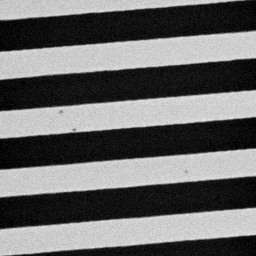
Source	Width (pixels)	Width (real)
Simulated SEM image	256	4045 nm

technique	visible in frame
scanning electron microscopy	lines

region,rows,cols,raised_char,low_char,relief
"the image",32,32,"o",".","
oooooooooooooooooooooooo........
oooooooooooo....................
................................
................................
........................oooooooo
............oooooooooooooooooooo
oooooooooooooooooooooooooooooooo
ooooooooooooooooooooooooooooo...
ooooooooooooooooo...............
ooooo...........................
................................
.............................ooo
.................ooooooooooooooo
......oooooooooooooooooooooooooo
oooooooooooooooooooooooooooooooo
ooooooooooooooooooooo...........
ooooooooo.......................
................................
................................
.....................ooooooooooo
.........ooooooooooooooooooooooo
oooooooooooooooooooooooooooooooo
oooooooooooooooooooooooooo......
oooooooooooooo..................
oo..............................
................................
..........................oooooo
..............oooooooooooooooooo
...ooooooooooooooooooooooooooooo
oooooooooooooooooooooooooooooo..
oooooooooooooooooo..............
oooooo..........................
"